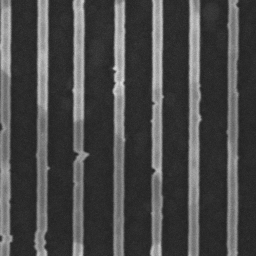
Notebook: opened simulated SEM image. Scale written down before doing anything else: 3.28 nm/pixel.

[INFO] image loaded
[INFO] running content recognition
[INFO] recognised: parallel lines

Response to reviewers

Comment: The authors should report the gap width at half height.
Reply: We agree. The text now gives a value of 98 nm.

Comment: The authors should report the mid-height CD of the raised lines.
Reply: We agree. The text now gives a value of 8.14 pixels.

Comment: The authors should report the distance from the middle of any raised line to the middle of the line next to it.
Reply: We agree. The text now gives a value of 0.124 µm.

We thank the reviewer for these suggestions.